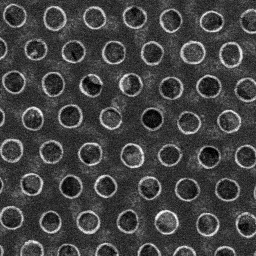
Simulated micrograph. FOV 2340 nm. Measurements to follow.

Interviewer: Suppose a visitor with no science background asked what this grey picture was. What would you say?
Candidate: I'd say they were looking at a regular array of raised bodies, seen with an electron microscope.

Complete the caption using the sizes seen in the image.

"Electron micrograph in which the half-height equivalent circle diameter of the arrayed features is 22 pixels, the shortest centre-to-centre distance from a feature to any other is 343 nm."